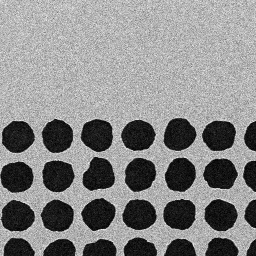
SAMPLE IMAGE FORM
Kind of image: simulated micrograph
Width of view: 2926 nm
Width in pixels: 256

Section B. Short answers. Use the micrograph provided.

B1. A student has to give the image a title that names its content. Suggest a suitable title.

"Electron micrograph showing a regular array of holes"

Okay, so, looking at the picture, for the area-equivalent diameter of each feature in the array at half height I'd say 367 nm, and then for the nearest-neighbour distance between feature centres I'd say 453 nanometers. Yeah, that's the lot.